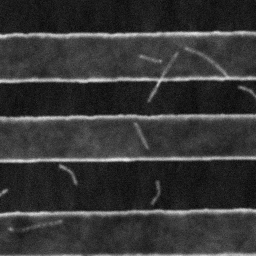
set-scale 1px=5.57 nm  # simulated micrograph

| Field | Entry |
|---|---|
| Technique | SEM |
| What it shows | lines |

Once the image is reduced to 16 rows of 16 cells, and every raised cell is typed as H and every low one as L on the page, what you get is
LLLLLLLLLLLLLLLL
LLLLLLLLLLLLLLLL
HHHHHHHHHHHHHHHH
HHHHHHHHHHHHHHHH
HHHHHHHHHHHHHHHH
LLLLLLLLLLLLLLLL
LLLLLLLLLLLLLLLL
HHHHHHHHHHHHHHHH
HHHHHHHHHHHHHHHH
HHHHHHHHHHHHHHHH
LLLLLLLLLLLLLLLL
LLLLLLLLLLLLLLLL
LLLLLLLLLLLLLLLL
HHHHHHHHHHHHHHHH
HHHHHHHHHHHHHHHH
HHHHHHHHHHHHHHHH